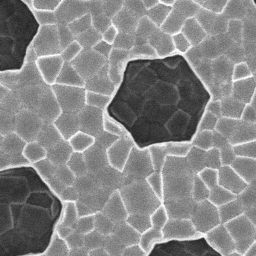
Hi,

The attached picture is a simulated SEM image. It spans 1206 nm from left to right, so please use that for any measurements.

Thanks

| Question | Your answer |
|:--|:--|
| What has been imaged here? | holes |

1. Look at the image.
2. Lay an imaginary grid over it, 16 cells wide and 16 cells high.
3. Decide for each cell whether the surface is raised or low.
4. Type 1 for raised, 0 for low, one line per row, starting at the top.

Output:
0011111111111111
0011111111111111
0011111111111111
0011111111111111
1111111100001111
1111111000000111
1111111000000111
1111111000000111
1111111100001111
1111111111111111
1011111111111111
0001111111111111
0000111111111111
0000111111111111
0001111111111111
0001111111000111